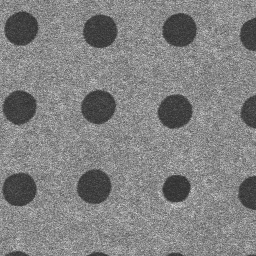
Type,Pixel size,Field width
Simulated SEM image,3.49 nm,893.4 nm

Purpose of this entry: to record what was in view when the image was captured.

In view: a regular array of holes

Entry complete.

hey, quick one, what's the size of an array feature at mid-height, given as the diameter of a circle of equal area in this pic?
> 118 nm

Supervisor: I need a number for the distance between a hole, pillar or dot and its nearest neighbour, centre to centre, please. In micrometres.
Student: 0.267